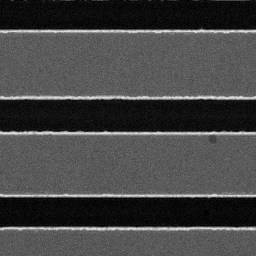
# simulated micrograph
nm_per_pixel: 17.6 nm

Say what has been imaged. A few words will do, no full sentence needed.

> lines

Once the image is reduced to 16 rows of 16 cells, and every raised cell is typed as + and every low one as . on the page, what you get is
................
................
++++++++++++++++
++++++++++++++++
++++++++++++++++
++++++++++++++++
................
................
++++++++++++++++
++++++++++++++++
++++++++++++++++
++++++++++++++++
................
................
++++++++++++++++
++++++++++++++++